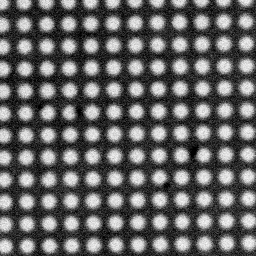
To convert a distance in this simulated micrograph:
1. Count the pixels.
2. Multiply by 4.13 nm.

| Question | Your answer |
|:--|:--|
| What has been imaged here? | an array of small figures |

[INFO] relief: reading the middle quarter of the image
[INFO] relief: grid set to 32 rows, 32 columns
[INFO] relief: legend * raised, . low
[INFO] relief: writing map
***..****..***..****..***..****.
***..****..***..****..***..****.
**....**...**....**.............
................................
............................**..
***..***...***..****..***..****.
***..****..***..****..***..****.
***..****..***...**...***...**..
................................
................................
.*....**....**...**...***...**..
***..****..***..****..***..****.
***..****..***..****..***...***.
***...**....*....**....*........
................................
................................
***...***..***...***..***...***.
***..****..***..****..***..****.
***..****..***...***..***...***.
................................
................................
.......*....**...**....**...***.
***..****..***..****..***...***.
***..****..***..****..***...***.
***...**....**...**....**....*..
................................
................................
***...***..***...***..***...***.
***..****..***...***..****..***.
***...***..***...***..***...***.
.*..............................
................................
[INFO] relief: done